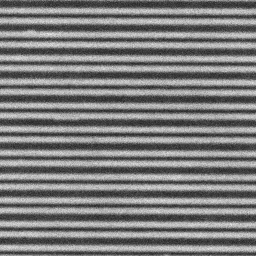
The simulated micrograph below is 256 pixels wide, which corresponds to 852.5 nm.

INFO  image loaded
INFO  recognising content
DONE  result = parallel lines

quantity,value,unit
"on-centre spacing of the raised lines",39.5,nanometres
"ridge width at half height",0.0196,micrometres